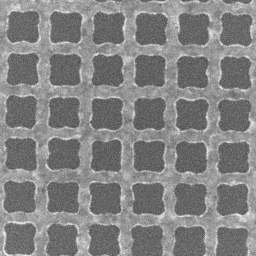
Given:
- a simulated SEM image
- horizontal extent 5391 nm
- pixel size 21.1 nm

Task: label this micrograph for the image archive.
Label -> a regular array of holes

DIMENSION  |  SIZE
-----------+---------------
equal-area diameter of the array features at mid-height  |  744 nanometres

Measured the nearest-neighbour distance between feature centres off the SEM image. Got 887 nm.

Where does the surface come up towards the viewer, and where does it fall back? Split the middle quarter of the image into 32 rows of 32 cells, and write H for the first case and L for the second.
LLLLHHHLLLLLLLLHHHLLLLLLLLHHLLLL
LLLLHHHLLLLLLLLHHHLLLLLLLHHHLLLL
LLLLHHHLLLLLLLLHHHLLLLLLLHHHLLLL
LLLLHHHLLLLLLLLHHHLLLLLLLHHHLLLL
LLLLHHHLLLLLLLLHHHLLLLLLLHHHLLLL
LLLHHHHHLHHLLLHHHHLLLLLLLHHHLLLL
HHHHHHHHHHHHHHHHHHHHHHHHHHHHHHHH
HHHHHHHHHHHHHHHHHHHHHHHHHHHHHHHH
LLLHHHHHLHHLLLHHHHHLLLLLHHHHHHHH
LLLLHHHLLLLLLLLHHLLLLLLLLHHHLLLL
LLLLHHHLLLLLLLLHHLLLLLLLLLHHLLLL
LLLLHHHLLLLLLLLHHLLLLLLLLHHHLLLL
LLLLHHHLLLLLLLLHHLLLLLLLLHHHLLLL
LLLLHHHLLLLLLLLHHLLLLLLLLHHHLLLL
LLLLHHLLLLLLLLLHHLLLLLLLLHHHLLLL
LLLLHHHLLLLLLLHHHLLLLLLLLHHHLLLL
HHHHHHHHLHHLLHHHHHLLHHHLHHHHHLLH
HHHHHHHHHHHHHHHHHHHHHHHHHHHHHHHH
HHLHHHHHHHHHHHHHHHHHHHHHHHHHHHHH
LLLLHHHLLLLLLLHHHHLLLLLLLHHHHLLL
LLLLHHHLLLLLLLLHHLLLLLLLLHHHLLLL
LLLLHHHLLLLLLLLHHLLLLLLLLHHHLLLL
LLLLHHHLLLLLLLLHHLLLLLLLLHHHLLLL
LLLLHHHLLLLLLLLHHLLLLLLLLHHHLLLL
LLLLHHLLLLLLLLLHHLLLLLLLLHHHLLLL
LLLLHHLLLLLLLLHHHLLLLLLLLHHHLLLL
HHHHHHHLLLLLLLHHHHLLLLLLLHHHLLLL
HHHHHHHHHHHHHHHHHHHHHHHHHHHHHHHH
HHHHHHHHHHHHHHHHHHHHHHHHHHHHHHHH
HLLHHHHLLHHHHHHHHHHHHHHLHHHHHHHH
LLLLHHLLLLLLLLHHHLLLLLLLLHHHLLLL
LLLLHHLLLLLLLLLHHLLLLLLLLHHHLLLL